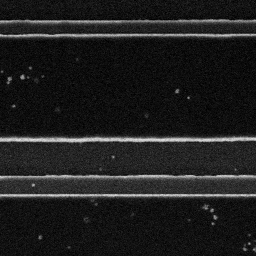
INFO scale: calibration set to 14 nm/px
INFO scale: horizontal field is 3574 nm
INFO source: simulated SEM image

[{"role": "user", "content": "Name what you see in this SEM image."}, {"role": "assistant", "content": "lines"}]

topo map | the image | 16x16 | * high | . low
................
................
****************
****************
****************
****************
****************
****************
****************
................
................
................
****************
****************
****************
****************